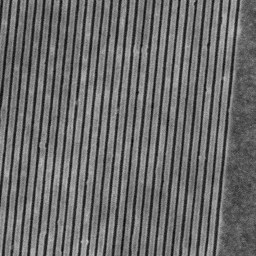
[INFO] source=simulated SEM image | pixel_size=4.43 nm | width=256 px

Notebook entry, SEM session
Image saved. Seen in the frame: parallel lines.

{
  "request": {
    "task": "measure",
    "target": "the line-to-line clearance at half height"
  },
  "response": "0.0154 micrometres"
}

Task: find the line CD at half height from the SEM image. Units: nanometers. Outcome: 23.7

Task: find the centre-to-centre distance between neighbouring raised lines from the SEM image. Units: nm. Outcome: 37.2